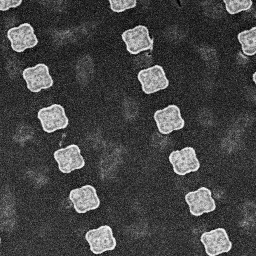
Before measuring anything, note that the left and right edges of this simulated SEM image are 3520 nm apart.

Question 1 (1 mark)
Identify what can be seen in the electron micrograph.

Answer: a regular array of raised bodies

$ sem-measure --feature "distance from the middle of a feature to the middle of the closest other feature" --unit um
0.593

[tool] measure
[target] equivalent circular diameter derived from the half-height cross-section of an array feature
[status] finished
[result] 363 nm